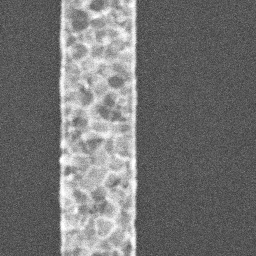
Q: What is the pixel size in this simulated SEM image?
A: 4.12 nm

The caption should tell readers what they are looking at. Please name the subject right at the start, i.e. one or a few lines or trenches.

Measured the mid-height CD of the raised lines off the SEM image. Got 0.294 µm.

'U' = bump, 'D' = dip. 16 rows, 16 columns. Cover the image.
DDDDUUUUDDDDDDDD
DDDDUUUUDDDDDDDD
DDDDUUUUDDDDDDDD
DDDDUUUUDDDDDDDD
DDDDUUUUDDDDDDDD
DDDDUUUUDDDDDDDD
DDDDUUUUDDDDDDDD
DDDDUUUUDDDDDDDD
DDDDUUUUDDDDDDDD
DDDDUUUUDDDDDDDD
DDDDUUUUDDDDDDDD
DDDDUUUUDDDDDDDD
DDDDUUUUDDDDDDDD
DDDDUUUUDDDDDDDD
DDDDUUUUDDDDDDDD
DDDDUUUUDDDDDDDD